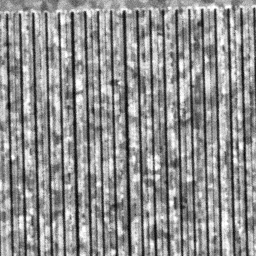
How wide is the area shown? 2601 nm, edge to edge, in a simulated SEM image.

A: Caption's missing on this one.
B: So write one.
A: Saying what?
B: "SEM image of parallel lines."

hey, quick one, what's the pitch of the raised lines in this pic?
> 0.0662 µm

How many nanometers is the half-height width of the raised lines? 40.6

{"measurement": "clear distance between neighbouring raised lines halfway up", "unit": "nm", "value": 30.5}